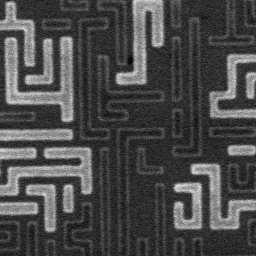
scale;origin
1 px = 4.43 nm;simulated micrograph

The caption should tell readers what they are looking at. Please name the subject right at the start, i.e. wiring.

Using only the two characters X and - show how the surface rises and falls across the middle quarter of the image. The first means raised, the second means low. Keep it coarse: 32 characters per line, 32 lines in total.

XX--XX---XX-------XX-------XX---
XX--XX---XX-------XX-------XX---
XX--XX---XX------XXX-------XX---
XX--XX---XX--XXXXXXX-------XX---
XX--XX---XX--XXXXXXX-------XX---
XX--XX---XX----------------XX---
XX--XX---XX----------------XX---
XX--XX---XXXXXXXXXXXXXXXX--XX---
XX--XX---XXXXXXXXXXXXXXXX--XX---
XX--XX---XXX--------------------
XX--XX---XX---------------------
XX--XX---XXX--------------------
XX--XX---XXXXXXX-----------XX---
XX--XX---XXXXXXX-----------XX---
----XX---------------------XX---
----XX---------------------XX---
----XXXXXXX--XXXXXXXXXXXX--XX---
XX--XXXXXXX--XXXXXXXXXXXX--XX---
XX--XXXXXXX--XXXXX--------------
-------------XXX----------------
-------------XXX---------------X
XXXXXX---XX--XXX---X-------XXXXX
XXXXXX---XX--XXX---X-------XXXXX
----XX---XX--XXX---X------------
-----X---XX---XX---X------------
----XX---XX---XX---XX-----------
XXXXXX---XX---XX---XXXXX--------
XXXXXX---XX---XX----------------
----XXX--XX---XX----------------
-----XX--XX---XX----------------
XX---XX--XX---XX-------XX---XXX-
XX---XX--XX---XX-------XX---XXXX